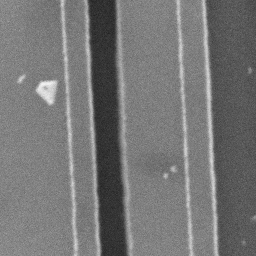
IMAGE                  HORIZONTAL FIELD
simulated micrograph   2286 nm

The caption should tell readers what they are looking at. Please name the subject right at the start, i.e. lines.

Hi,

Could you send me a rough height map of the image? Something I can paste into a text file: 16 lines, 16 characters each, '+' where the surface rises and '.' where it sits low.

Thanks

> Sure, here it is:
+++++..++++++...
+++++..++++++...
++++++.++++++...
++++++..+++++...
++++++..+++++...
++++++..+++++...
++++++..+++++...
++++++..+++++...
++++++..+++++...
++++++..+++++...
++++++..+++++...
++++++..+++++...
++++++..+++++...
++++++..+++++...
++++++..++++++..
++++++..++++++..